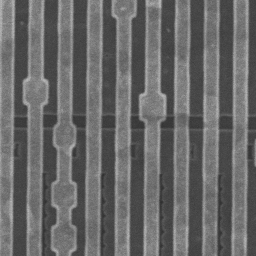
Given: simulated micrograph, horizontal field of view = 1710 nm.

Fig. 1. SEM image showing wiring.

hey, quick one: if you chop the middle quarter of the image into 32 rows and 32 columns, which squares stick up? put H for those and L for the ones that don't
HHLLLLHHHLLLLLHHLLLLLHHHLLLLHHHL
HHLLLLHHHLLLLLHHLLLLLHHHLLLLHHHL
HHLLLLHHHLLLLLHHLLLLLHHHLLLLHHHL
HHLLLLHHHLLLLLHHLLLLLHHHLLLLHHHL
HHLLLLHHHLLLLHHHLLLLLHHHLLLLHHHL
HHLLLLHHHLLLLHHHLLLLLHHHLLLLHHHL
HHLLLLHHHLLLLHHHLLLLLHHHLLLLHHHL
HHLLLLHHHLLLLHHHLLLLHHHHLLLLHHHL
HHLLLLHHHLLLLHHHLLLHHHHHHLLLHHHL
HHLLLLHHHLLLLHHHLLLHHHHHHLLLHHHL
HHLLLLHHHLLLLHHHLLLHHHHHHLLLHHHL
HHLLLLHHHLLLLHHHLLLHHHHHHLLLHHHL
HHLLLLHHHLLLLHHHLLLHHHHHHLLLHHHL
HHLLLLHHHLLLLHHHLLLHHHHHHLLLHHHL
HHLLLLHHHLLLLHHHLLLLLHHHLLLLHHHL
HHLLLLHHHLLLLHHHLLLLLHHHLLLLHHHL
HHHLLLHHHLLLLHHHLLLLLHHHLLLLHHHL
HHHLLLHHHLLLLHHHLLLLLHHHLLLLHHHL
HHHLLLHHHLLLLHHHLLLLLHHHLLLLHHHL
HHHLLLHHHLLLLHHHLLLLLHHHLLLLHHHL
HHLLLLHHHLLLLHHHLLLLLHHHLLLLHHHL
HLLLLLHHHLLLLHHHLLLLLHHHLLLLHHHL
HLLLLLHHHLLLLHHHLLLLLHHHLLLLHHHL
HLLLLLHHHLLLLHHHLLLLLHHHLLLLHHHL
HLLLLLHHHLLLLHHHLLLLLHHHLLLLHHHL
HLLLLLHHHLLLLHHHLLLLLHHHLLLLHHHL
HLLLLLHHHLLLLHHHLLLLLHHHLLLLHHHL
HLLLLLHHHLLLLHHHLLLLLHHHLLLLHHHL
HLLLLLHHHLLLLHHHLLLLLHHLLLLLHHHL
HHLLLLHHHLLLLHHHLLLLLHHLLLLLHHHL
HHHLLLHHHLLLLHHHLLLLHHHLLLLLHHHL
HHHLLLHHHLLLLHHHLLLLHHHLLLLLHHHL